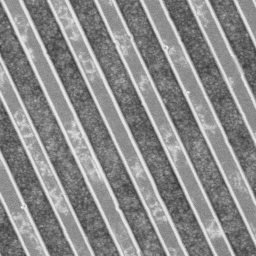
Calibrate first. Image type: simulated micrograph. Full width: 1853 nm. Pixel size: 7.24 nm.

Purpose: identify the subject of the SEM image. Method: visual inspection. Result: parallel lines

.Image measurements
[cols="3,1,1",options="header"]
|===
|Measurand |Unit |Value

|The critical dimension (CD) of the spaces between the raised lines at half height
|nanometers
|186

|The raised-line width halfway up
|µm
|0.116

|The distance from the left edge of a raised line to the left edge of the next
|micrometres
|0.305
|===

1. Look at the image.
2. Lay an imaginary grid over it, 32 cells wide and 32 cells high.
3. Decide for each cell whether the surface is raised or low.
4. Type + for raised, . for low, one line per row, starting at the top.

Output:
+++...+++...++....++....++....++
.++....++....++...+++...++....++
.+++...++....++....++....++....+
..++....++....++...+++...++....+
..+++...++....++....++....++...+
...++....++....++...+++...++....
...+++...++....++....++....++...
....++....++...+++...+++...++...
+...+++...++....++....++....++..
+....++....++...+++...+++...++..
+....++....++....++....++....++.
++....++...+++...++....++....++.
++....++....++....++....++...+++
.++....++...+++...+++...++....++
.++....++....++....++...+++...++
..++....++...+++...++....++....+
..++....++....++....++...+++...+
...++...+++...+++...++....++....
...++....++....++....++...+++...
....++...+++...++....++....++...
+...++....++....++....++...+++..
+....++...+++...++....++....++..
+....++....++....++....++...+++.
++....++...+++...++....++....++.
++....++....++....++...+++...+++
.++...+++...+++...++....++....++
.++....++....++....++...+++...++
.+++...++....++....++....++....+
..++....++....++....++...+++...+
..+++...++....++....++....++....
...++....++....++...+++...+++...
...+++...++....++....++....++...